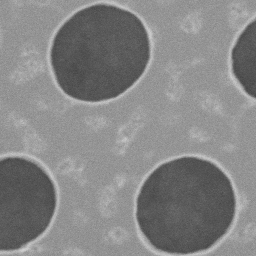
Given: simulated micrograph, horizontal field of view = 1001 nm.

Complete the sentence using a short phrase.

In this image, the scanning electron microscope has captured holes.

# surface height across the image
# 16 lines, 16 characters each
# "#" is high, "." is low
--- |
#####..#########
####.....#######
###......######.
###......#####..
###......######.
####....#######.
################
################
################
################
...#######....##
...######.....##
....#####......#
...######......#
...######.....##
.#########...###